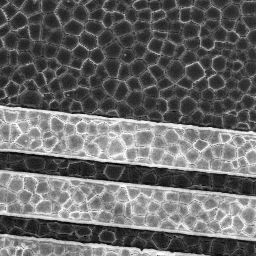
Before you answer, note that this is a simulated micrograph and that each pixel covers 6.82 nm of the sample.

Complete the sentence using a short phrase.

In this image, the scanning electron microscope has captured one or a few lines or trenches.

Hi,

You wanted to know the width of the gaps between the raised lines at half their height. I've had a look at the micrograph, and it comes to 141 nm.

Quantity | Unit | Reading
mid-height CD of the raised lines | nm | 294